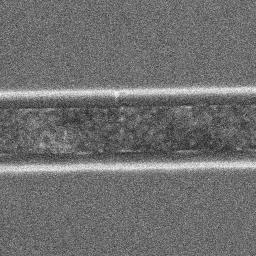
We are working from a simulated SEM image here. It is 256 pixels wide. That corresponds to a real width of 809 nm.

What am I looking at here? one or a few lines or trenches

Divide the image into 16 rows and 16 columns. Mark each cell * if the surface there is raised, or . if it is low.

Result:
****************
****************
****************
****************
****************
****************
................
................
................
................
.***************
****************
****************
****************
****************
****************